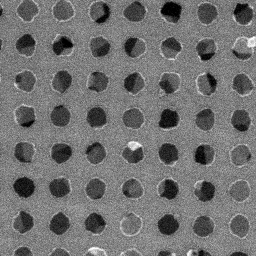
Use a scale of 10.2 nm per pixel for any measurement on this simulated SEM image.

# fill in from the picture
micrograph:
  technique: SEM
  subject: a regular array of raised bodies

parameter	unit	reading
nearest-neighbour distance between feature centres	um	0.36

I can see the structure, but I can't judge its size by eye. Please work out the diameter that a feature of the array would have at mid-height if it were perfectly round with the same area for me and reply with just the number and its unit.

230 nm